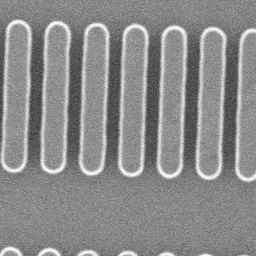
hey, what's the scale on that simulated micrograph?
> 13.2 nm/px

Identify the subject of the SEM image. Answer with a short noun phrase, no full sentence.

groups of lines, slits or small figures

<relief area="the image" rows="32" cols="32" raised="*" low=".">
................................
................................
................................
.***..**...**...**...*..........
.***..***..**...**..***..***..**
.***..***..**...**..***..***..**
.***..***..**..***..***..***..**
.***..**...**..***..***..***..**
.***..**..***..***..***..***..**
.***..**..***..***..***..***..**
.***..**..***..***..***..***..**
.***..**..***..***..***..***..**
.***..**..***..***..***..***..**
.**...**..***..***..***..***..**
***..***..***..***..***..***..**
***..***..***..***..***..***..**
***..***..***..***..***..***..**
***..***..***..***..***..***..**
***..***..***..***..***..***..**
***..***..***..***..***..***..**
***..***..***..***..***..***..**
...........*...**...**...**...**
................................
................................
................................
................................
................................
................................
................................
................................
................................
**...**.........................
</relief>